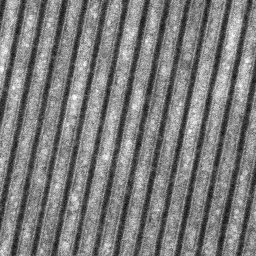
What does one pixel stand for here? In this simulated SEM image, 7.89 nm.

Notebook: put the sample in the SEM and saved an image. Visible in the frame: parallel lines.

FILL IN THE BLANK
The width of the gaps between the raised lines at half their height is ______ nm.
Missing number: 92.8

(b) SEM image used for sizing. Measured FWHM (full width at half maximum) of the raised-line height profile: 65.8 nm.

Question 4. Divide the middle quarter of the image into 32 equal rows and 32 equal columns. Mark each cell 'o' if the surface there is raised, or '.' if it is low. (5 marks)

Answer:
.oo...oo...oo...oo...ooo...oo...
.oo...oo...oo...oo...oo...ooo...
.oo...oo...oo...oo...oo...oo...o
oo....oo...oo...oo...oo...oo...o
oo...oo...ooo...oo...oo...oo...o
oo...oo...oo...oo....oo...oo...o
oo...oo...oo...oo...oo...ooo...o
oo...oo...oo...oo...oo...oo...oo
o....oo...oo...oo...oo...oo...oo
o...oo...ooo...oo...oo...oo...oo
o...oo...oo...oo...ooo...oo...oo
o...oo...oo...oo...oo...ooo...oo
o...oo...oo...oo...oo...oo...oo.
....oo...oo...oo...oo...oo...oo.
...oo...oo....oo...oo...oo...oo.
...oo...oo...oo....oo...oo...oo.
...oo...oo...oo...oo...oo....oo.
...oo...oo...oo...oo...oo...oo..
..ooo...oo...oo...oo...oo...oo..
..oo...oo....oo...oo...oo...oo..
..oo...oo...oo...ooo...oo...oo..
..oo...oo...oo...oo...oo....oo..
..oo...oo...oo...oo...oo...oo...
.oo....oo...oo...oo...oo...oo...
.oo...oo....oo...oo...oo...oo...
.oo...oo...oo...ooo...oo...oo...
.oo...oo...oo...oo...oo....oo...
.oo...oo...oo...oo...oo...oo...o
oo....oo...oo...oo...oo...oo...o
oo...oo....oo...oo...oo...oo...o
oo...oo...oo...oo...ooo...oo...o
oo...oo...oo...oo...oo....oo...o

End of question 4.